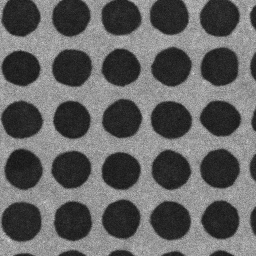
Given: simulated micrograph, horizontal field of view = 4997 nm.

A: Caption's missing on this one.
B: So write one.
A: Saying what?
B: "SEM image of a regular array of holes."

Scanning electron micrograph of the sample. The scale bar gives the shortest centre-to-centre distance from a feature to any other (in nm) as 960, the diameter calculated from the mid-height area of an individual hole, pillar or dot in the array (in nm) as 753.